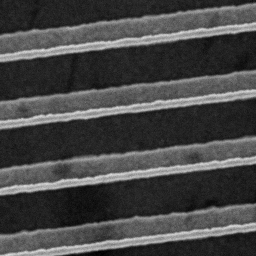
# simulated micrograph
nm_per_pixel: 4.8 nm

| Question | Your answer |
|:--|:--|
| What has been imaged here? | lines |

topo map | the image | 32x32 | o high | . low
...............................o
.......................ooooooooo
...............ooooooooooooooooo
.......ooooooooooooooooooooooooo
oooooooooooooooooooooooooo......
oooooooooooooooooo..............
oooooooooo......................
oo..............................
................................
...........................ooooo
..................oooooooooooooo
..........oooooooooooooooooooooo
.oooooooooooooooooooooooooooo...
ooooooooooooooooooooo...........
ooooooooooooo...................
ooooo...........................
................................
.............................ooo
.....................ooooooooooo
.............ooooooooooooooooooo
.....ooooooooooooooooooooooooooo
ooooooooooooooooooooooo.........
ooooooooooooooo.................
ooooooo.........................
................................
................................
........................oooooooo
...............ooooooooooooooooo
........oooooooooooooooooooooooo
ooooooooooooooooooooooooooo.....
ooooooooooooooooooo.............
oooooooooo......................